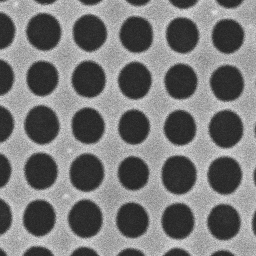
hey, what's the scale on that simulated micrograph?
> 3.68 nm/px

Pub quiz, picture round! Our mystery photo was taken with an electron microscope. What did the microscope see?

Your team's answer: a regular array of holes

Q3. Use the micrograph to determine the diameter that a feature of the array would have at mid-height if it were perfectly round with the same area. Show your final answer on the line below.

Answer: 132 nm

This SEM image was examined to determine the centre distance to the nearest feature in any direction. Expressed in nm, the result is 169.